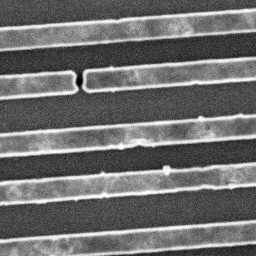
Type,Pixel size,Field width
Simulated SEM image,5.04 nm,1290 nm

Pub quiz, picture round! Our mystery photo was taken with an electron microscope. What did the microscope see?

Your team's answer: parallel lines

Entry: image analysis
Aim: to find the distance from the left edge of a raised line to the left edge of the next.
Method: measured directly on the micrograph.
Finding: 264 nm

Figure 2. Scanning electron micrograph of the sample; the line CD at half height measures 0.112 microns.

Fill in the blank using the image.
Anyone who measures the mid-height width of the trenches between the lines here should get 175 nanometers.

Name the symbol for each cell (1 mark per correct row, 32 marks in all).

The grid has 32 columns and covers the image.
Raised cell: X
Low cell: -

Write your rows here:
--------------------------------
----------------------------XXXX
---------------XXXXXXXXXXXXXXXXX
-XXXXXXXXXXXXXXXXXXXXXXXXXXXXXXX
XXXXXXXXXXXXXXXXXXXXXXXX--------
XXXXXXXXXXX---------------------
--------------------------------
----------------------------XXXX
---------------XXXXXXXXXXXXXXXXX
-XXXXXXXX-XXXXXXXXXXXXXXXXXXXXXX
XXXXXXXXX-XXXXXXXXXXXXXX--------
XXXXXXXXX-----------------------
--------------------------------
--------------------------------
-----------------------------XX-
-----------------XXXXXXXXXXXXXXX
----XXXXXXXXXXXXXXXXXXXXXXXXXXXX
XXXXXXXXXXXXXXXXXXXXXXXXXXX-----
XXXXXXXXXXXXX-------------------
--------------------------------
-------------------------------X
------------------XXXXXXXXXXXXXX
-----XXXXXXXXXXXXXXXXXXXXXXXXXXX
XXXXXXXXXXXXXXXXXXXXXXXXX-------
XXXXXXXXXXXXX-------------------
--------------------------------
--------------------------------
--------------------------------
---------------------XXXXXXXXXXX
--------XXXXXXXXXXXXXXXXXXXXXXXX
XXXXXXXXXXXXXXXXXXXXXXXXXXXXXX--
XXXXXXXXXXXXXXXXX---------------